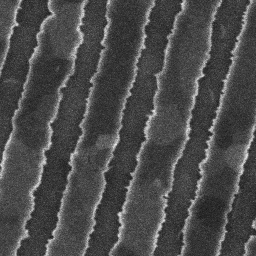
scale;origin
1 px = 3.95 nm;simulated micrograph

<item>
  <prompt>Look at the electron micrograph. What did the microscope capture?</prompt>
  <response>one or a few lines or trenches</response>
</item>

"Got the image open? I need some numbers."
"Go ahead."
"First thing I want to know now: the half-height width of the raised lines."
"153 nm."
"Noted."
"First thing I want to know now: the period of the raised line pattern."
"254 nm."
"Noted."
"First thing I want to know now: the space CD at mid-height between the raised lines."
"101 nanometers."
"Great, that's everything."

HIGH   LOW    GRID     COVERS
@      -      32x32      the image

@@----@@@@@--@@@@@@----@@@@----@
@@----@@@@---@@@@@@---@@@@@----@
@@----@@@@---@@@@@----@@@@@----@
@@---@@@@@---@@@@@----@@@@@---@@
@----@@@@@---@@@@@---@@@@@----@@
@----@@@@@---@@@@@---@@@@@----@@
@---@@@@@@---@@@@@---@@@@@---@@@
@---@@@@@---@@@@@----@@@@@---@@@
----@@@@@---@@@@@---@@@@@----@@@
----@@@@@---@@@@@---@@@@@---@@@@
---@@@@@---@@@@@@---@@@@@---@@@@
---@@@@----@@@@@----@@@@@---@@@@
--@@@@@@---@@@@@---@@@@@----@@@@
--@@@@@----@@@@----@@@@@---@@@@@
--@@@@@----@@@@----@@@@@---@@@@@
--@@@@----@@@@@---@@@@@@---@@@@@
--@@@@@---@@@@@---@@@@@---@@@@@@
-@@@@@----@@@@@---@@@@@---@@@@@-
-@@@@@----@@@@----@@@@@---@@@@@-
@@@@@@---@@@@@---@@@@@@---@@@@@-
@@@@@----@@@@@---@@@@@---@@@@@--
@@@@@----@@@@----@@@@@---@@@@@--
@@@@@----@@@@---@@@@@@---@@@@@--
@@@@----@@@@@---@@@@@----@@@@@--
@@@@----@@@@@---@@@@@----@@@@---
@@@@----@@@@----@@@@@---@@@@@---
@@@@---@@@@@---@@@@@@---@@@@@---
@@@@---@@@@@---@@@@@---@@@@@----
@@@----@@@@@---@@@@@---@@@@@----
@@@----@@@@----@@@@@---@@@@@----
@@----@@@@@----@@@@----@@@@@---@
@@----@@@@@---@@@@@----@@@@----@